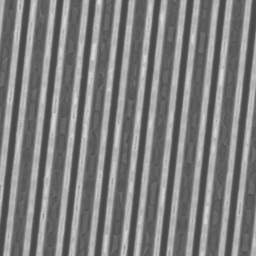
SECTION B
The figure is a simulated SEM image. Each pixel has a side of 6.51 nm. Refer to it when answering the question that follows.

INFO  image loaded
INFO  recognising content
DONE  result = parallel lines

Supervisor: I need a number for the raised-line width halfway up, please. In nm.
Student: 49.4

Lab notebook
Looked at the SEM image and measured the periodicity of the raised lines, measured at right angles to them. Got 105 nm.